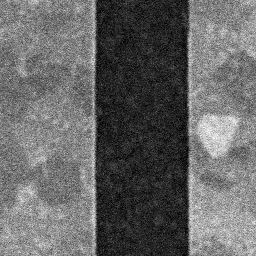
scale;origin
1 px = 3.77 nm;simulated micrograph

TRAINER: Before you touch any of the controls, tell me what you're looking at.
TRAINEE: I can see one or a few lines or trenches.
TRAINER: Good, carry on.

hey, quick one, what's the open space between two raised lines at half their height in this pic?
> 356 nm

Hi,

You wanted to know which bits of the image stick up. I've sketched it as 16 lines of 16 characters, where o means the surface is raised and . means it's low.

oooooo......oooo
oooooo......oooo
oooooo......oooo
oooooo......oooo
oooooo......oooo
oooooo......oooo
oooooo......oooo
oooooo......oooo
oooooo......oooo
oooooo......oooo
oooooo......oooo
oooooo......oooo
oooooo......oooo
oooooo......oooo
oooooo......oooo
oooooo......oooo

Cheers